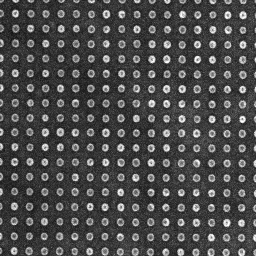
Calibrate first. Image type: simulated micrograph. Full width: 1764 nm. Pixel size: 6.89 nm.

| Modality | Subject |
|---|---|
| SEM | a regular array of raised bodies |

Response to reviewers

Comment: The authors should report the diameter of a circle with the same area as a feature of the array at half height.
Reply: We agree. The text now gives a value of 0.0454 um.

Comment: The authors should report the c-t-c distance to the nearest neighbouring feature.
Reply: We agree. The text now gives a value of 100 nanometers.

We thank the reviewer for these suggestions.